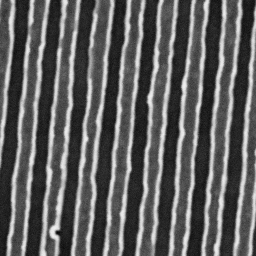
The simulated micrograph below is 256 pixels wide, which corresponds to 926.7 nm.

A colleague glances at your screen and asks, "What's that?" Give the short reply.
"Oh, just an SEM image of parallel lines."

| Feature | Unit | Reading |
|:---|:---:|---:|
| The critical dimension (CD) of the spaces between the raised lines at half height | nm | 50.6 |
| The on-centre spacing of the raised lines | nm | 117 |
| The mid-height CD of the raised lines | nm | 65.9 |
